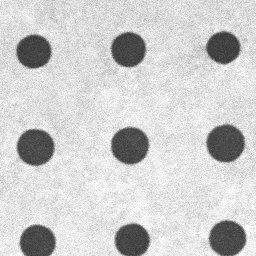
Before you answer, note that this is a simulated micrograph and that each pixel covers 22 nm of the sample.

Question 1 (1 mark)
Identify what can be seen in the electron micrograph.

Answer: holes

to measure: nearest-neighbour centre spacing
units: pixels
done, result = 94.9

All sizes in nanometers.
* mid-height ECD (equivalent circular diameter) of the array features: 804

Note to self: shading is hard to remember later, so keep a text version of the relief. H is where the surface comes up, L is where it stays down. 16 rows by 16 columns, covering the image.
HHHHHHHHHHHHHHHH
HHHHHHHHHHHHHHHH
HLLHHHHLLHHHHLLH
HLLHHHHLLHHHHLLH
HHHHHHHHHHHHHHHH
HHHHHHHHHHHHHHHH
HHHHHHHHHHHHHHHH
HHHHHHHHHHHHHHHH
HLLHHHHLLHHHHLLH
HLLHHHHLLHHHHLLH
HHHHHHHHHHHHHHHH
HHHHHHHHHHHHHHHH
HHHHHHHHHHHHHHHH
HHHHHHHHHHHHHHHH
HHLHHHHLLHHHHLLH
HLLHHHHLLHHHHLLH